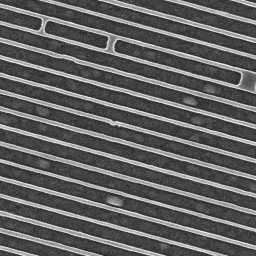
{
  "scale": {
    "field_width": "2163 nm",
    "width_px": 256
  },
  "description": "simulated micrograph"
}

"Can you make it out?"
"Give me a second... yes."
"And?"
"parallel lines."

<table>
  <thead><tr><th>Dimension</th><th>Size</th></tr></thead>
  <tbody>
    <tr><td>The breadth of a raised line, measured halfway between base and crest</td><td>31.6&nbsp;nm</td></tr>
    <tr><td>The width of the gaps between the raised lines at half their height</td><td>113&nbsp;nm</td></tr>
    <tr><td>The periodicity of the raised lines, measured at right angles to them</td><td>141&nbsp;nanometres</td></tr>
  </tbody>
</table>